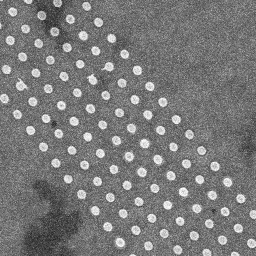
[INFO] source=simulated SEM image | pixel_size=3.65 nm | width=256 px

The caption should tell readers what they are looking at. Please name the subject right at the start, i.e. a regular array of raised bodies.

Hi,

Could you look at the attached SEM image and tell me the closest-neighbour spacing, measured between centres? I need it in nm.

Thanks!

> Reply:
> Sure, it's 72.6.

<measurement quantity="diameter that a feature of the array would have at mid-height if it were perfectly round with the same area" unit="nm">30.3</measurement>